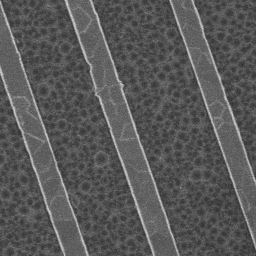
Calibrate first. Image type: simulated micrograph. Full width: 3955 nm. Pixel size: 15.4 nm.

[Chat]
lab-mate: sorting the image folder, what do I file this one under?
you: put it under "one or a few lines or trenches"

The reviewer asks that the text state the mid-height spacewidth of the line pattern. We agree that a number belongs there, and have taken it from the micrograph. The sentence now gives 983 nanometers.